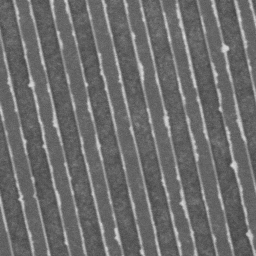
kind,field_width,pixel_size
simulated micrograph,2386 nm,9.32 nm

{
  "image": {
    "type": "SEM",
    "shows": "parallel lines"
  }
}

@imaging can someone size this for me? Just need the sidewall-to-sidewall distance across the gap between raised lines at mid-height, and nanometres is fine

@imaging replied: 178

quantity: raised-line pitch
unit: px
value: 35.9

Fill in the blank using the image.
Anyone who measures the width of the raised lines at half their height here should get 154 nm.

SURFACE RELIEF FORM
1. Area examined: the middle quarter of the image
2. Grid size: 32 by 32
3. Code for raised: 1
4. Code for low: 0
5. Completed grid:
11110000011111000001111000001111
11111000011111000001111000001111
11111000011111000001111000001111
01111000001111000001111000001111
01111000001111000001111100000111
01111100001111100000111100000111
01111100001111100000111100000111
00111100000111100000111100000111
00111100000111100000111100000111
00111100000111110000011110000011
00111110000111110000011110000011
00111110000011110000011110000011
00011110000011110000011111000011
00011110000011110000011111000001
00011111000011111000011111000001
00011111000001111000001111000001
00001111000001111000001111000001
00001111000001111000001111100001
00001111000001111100000111100000
00001111100000111100000111100000
00000111100000111100000111100000
00000111100000111100000111100000
00000111100000111100000111110000
00000111110000011110000011110000
00000111110000011110000011110000
10000011110000011110000011110000
10000011110000011110000011110000
10000011110000011111000011111000
11000011110000001111000001111000
11000001111000001111000001111000
11000001111000001111000001111000
11000001111000001111000001111100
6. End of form